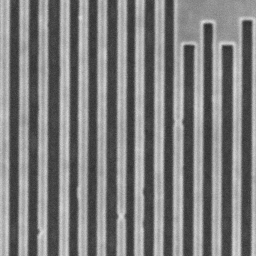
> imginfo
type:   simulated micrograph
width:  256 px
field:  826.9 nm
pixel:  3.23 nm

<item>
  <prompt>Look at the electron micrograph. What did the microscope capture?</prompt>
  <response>parallel lines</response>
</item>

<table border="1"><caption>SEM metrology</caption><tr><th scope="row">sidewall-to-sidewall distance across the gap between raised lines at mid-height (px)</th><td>11.5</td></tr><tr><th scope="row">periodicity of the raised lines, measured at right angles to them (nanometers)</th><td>62.7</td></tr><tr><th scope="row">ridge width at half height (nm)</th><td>24.7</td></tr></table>